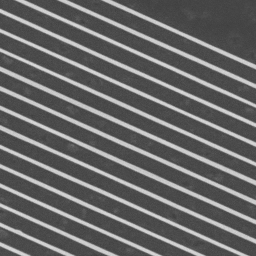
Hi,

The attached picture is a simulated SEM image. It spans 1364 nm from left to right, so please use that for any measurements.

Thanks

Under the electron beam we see parallel lines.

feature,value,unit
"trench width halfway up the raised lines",76.7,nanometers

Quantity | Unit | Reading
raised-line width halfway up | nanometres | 18.2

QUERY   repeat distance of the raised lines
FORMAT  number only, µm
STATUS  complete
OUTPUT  0.0944